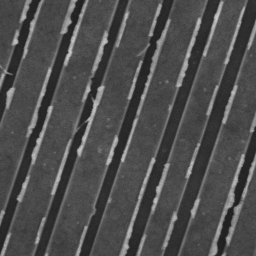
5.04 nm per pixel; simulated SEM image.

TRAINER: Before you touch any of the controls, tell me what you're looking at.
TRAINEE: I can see parallel lines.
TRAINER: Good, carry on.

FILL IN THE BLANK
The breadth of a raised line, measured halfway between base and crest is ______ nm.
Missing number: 163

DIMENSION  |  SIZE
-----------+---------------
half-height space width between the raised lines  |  52.7 nanometres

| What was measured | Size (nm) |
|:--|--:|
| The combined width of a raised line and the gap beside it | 213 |